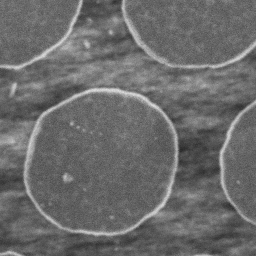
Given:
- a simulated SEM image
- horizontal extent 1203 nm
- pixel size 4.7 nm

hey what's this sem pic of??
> raised bodies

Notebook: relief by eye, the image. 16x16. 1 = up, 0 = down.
1111100011111111
1111100011111111
1111000001111111
1110000001111110
0000000000000000
0000000000000000
0000111111000000
0011111111100001
0011111111100011
0011111111100011
0011111111100011
0011111111100011
0011111111000011
0001111110000001
0000011100000000
0000000000000000